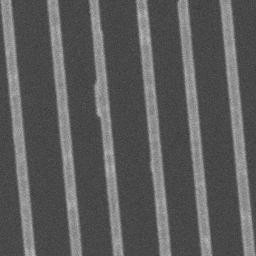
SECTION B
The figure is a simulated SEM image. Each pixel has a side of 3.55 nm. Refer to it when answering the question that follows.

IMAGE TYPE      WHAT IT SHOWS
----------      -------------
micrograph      parallel lines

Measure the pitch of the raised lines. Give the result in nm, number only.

155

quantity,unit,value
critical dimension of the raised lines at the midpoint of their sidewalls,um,0.0344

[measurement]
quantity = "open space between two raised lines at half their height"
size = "117 nm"